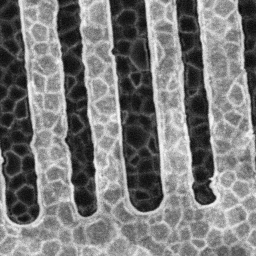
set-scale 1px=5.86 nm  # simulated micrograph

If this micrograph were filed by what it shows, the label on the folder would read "one or a few lines or trenches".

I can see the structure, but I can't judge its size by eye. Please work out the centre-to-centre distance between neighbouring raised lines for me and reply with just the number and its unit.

353 nanometres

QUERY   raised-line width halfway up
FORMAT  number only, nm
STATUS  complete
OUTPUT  179